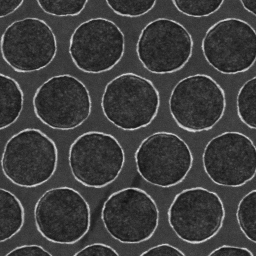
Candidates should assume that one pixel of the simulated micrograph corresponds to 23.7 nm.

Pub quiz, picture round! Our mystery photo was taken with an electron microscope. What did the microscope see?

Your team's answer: a regular array of holes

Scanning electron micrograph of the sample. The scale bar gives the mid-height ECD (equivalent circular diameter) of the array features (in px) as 53.1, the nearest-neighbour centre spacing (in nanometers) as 1550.